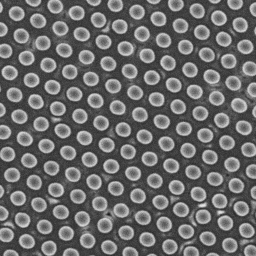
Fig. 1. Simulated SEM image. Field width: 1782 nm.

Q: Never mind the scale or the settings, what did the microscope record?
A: a regular array of raised bodies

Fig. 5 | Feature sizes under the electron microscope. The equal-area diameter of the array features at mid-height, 102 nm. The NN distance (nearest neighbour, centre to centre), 22.1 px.